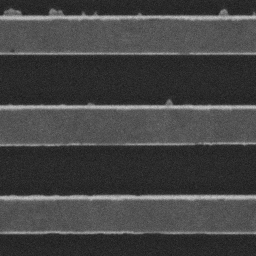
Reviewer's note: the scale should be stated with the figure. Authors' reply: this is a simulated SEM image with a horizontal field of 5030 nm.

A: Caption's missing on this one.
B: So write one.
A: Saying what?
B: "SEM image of lines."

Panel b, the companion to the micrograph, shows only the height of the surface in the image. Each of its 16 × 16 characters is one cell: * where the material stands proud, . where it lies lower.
................
****************
****************
................
................
................
................
****************
****************
................
................
................
****************
****************
****************
................